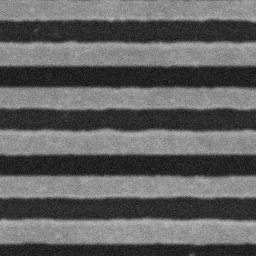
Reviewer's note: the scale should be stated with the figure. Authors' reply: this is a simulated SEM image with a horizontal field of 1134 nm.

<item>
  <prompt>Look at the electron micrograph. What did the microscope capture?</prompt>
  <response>lines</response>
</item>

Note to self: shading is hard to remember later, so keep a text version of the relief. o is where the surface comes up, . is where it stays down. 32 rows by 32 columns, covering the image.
oooooooooooooooooooooooooooooooo
oooooooooooooooooooooooooooooooo
.oo..o.......o...........o.....o
................................
................................
oooooooooooooooooo.ooooooooooooo
oooooooooooooooooooooooooooooooo
oooooooooooooooooooooooooooooooo
................................
................................
................................
oooooooooooooooooooooooooooooooo
oooooooooooooooooooooooooooooooo
.oo..oooooooooooooooooooooo..ooo
................................
................................
ooo..ooo....ooo...oooo........oo
oooooooooooooooooooooooooooooooo
oooooooooooooooooooooooooooooooo
................................
................................
................................
oooooooooooooooooooooooooooooooo
oooooooooooooooooooooooooooooooo
oooooooooooooooooooooo..oooooooo
................................
................................
...o.o...........oooo....o......
oooooooooooooooooooooooooooooooo
oooooooooooooooooooooooooooooooo
........................oo......
................................